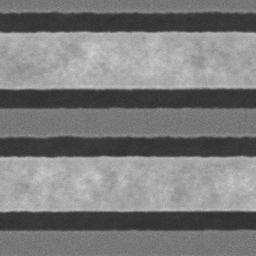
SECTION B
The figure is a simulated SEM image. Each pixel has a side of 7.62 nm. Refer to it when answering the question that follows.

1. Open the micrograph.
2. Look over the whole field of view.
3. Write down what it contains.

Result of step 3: lines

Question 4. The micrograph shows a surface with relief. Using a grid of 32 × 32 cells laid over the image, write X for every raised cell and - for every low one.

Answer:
XXXXXXXXXXXXXXXXXXXXXXXXXXXXXXXX
XXXXXX-XXXXXXXXXXXXXXXXXX---XXXX
--------------------------------
--------------------------------
XXXXXXXXXXXXXXXXXXXXXXXXXXXXXXXX
XXXXXXXXXXXXXXXXXXXXXXXXXXXXXXXX
XXXXXXXXXXXXXXXXXXXXXXXXXXXXXXXX
XXXXXXXXXXXXXXXXXXXXXXXXXXXXXXXX
XXXXXXXXXXXXXXXXXXXXXXXXXXXXXXXX
XXXXXXXXXXXXXXXXXXXXXXXXXXXXXXXX
XXXXXXXXXXXXXXXXXXXXXXXXXXXXXXXX
--------------------------------
--------------------------------
--------------------------------
XXXXXXXXXXXXXXXXXXXXXXXXXXXXXXXX
XXXXXXXXXXXXXXXXXXXXXXXXXXXXXXXX
XXXXXXXXXXXXXXXXXXXXXXXXXXXXXXXX
--------------------------------
--------------------------------
--------------------------------
XXXXXXXXXXXXXXXXXXXXXXXXXXXXXXXX
XXXXXXXXXXXXXXXXXXXXXXXXXXXXXXXX
XXXXXXXXXXXXXXXXXXXXXXXXXXXXXXXX
XXXXXXXXXXXXXXXXXXXXXXXXXXXXXXXX
XXXXXXXXXXXXXXXXXXXXXXXXXXXXXXXX
XXXXXXXXXXXXXXXXXXXXXXXXXXXXXXXX
--------------------------------
--------------------------------
--------------------------------
XXXXXXXXXXXXXXXXXXXXXXXXXXXXXXXX
XXXXXXXXXXXXXXXXXXXXXXXXXXXXXXXX
XXXXXXXXXXXXXXXXXXXXXXXXXXXXXXXX